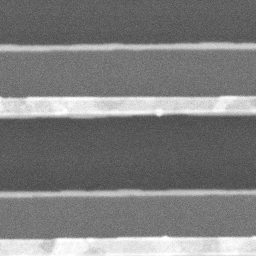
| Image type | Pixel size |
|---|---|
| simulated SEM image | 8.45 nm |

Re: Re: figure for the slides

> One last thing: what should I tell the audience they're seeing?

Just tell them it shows lines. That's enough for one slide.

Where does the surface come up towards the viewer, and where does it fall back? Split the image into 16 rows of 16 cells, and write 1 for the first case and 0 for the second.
0000000000000000
0000000000000000
0000000000000000
1111111111111111
1111111111111111
1111111111111111
1111111111111111
0000000000000000
0000000000000000
0000000000000000
0000000000000000
0000000000000000
1111111111111111
1111111111111111
1111111111111111
1111111111111111